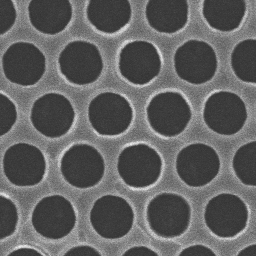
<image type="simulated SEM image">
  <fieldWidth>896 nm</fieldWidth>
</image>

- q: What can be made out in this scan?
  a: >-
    a regular array of holes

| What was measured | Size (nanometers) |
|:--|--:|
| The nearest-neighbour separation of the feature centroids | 200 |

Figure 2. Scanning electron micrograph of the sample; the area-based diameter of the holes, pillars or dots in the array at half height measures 153 nanometres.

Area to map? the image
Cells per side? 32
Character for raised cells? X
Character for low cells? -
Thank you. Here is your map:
--XX-----XX-----XX-----XX------X
--XX-----XX-----XX-----XX------X
--XX-----XX-----XX-----XXX----XX
-XXX----XXXX---XXXX----XXXX--XXX
XXXXXXXXXXXXXXXXXXXXXXXXXXXXXXXX
XX--XXXXX--XXXXX---XXXX---XXXX--
X----XXX----XXX-----XX-----XX---
------X------XX-----XX-----XX---
------XX-----XX-----XX-----XX---
X----XXX----XXX----XXX-----XXX--
XX--XXXXXX-XXXXXX-XXXXXX-XXXXXXX
XXXXXXXXXXXXXXXXXXXXXXXXXXXXXXXX
-XXXX----XXX----XXX----XXX----XX
--XX-----XX-----XX------XX-----X
--XX-----XX------X------X------X
--XX-----XX-----XXX----XXX-----X
-XXXX---XXXX---XXXXX---XXXX---XX
XXXXXXXXXXXXXXXXXXXXXXXXXXXXXXXX
X----XXXX---XXXX---XXXX---XXXX--
X----XXX-----XX-----XX-----XX---
------XX-----XX-----XX-----XX---
X-----XX-----XX-----XX-----XX---
X----XXX-----XX-----XXX---XXXX--
XXXXXXXXXXXXXXXXXXXXXXXXXXXXXXXX
XXXXXXX-XXXXX--XXXXX---XXXX--XXX
--XXX----XXX----XXX----XXX-----X
--XX-----XX------X------XX-----X
--XX-----XX------XX-----XX-----X
--XX-----XXX----XXX----XXX----XX
-XXXX---XXXXX--XXXXX--XXXXX--XXX
XXXXXXXXXXXXXXXXXXXXXXXXXXXXXXXX
XX---XXX----XXXX---XXXX----XXX--